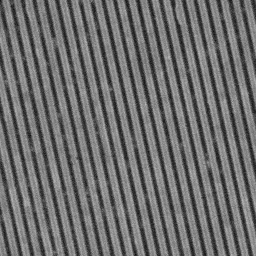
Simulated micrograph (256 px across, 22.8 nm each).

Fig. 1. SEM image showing parallel lines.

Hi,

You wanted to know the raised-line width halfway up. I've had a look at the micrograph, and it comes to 5.13 px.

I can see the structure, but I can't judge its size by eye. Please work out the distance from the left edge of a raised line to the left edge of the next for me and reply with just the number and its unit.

256 nm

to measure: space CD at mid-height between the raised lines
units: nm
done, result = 136